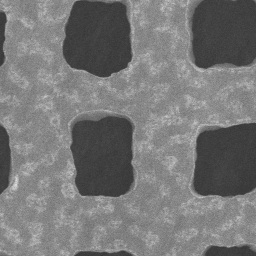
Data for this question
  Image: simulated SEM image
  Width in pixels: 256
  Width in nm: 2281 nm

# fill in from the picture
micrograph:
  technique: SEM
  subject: holes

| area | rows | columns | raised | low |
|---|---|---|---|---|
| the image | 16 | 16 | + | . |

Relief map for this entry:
++++....++++....
++++....++++....
++++....++++....
++++....++++....
+++++..+++++++++
++++++++++++++++
++++++++++++++++
+++++...++++++++
.+++....++++....
.+++....++++....
.++++...++++....
.++++...++++....
++++++++++++++++
++++++++++++++++
++++++++++++++++
+++++++++++++...